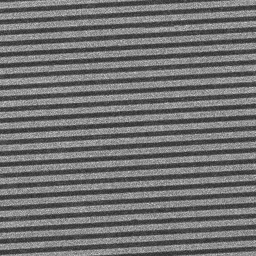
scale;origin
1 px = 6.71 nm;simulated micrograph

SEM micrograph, parallel lines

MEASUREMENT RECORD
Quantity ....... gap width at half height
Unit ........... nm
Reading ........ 37.7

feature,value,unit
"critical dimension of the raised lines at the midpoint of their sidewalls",0.0377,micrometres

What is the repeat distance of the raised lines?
73.5 nm